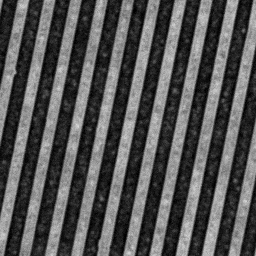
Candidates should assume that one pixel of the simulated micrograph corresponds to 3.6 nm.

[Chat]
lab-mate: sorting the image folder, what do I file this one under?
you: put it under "parallel lines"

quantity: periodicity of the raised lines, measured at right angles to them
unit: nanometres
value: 92.4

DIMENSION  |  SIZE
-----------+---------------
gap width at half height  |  57.3 nm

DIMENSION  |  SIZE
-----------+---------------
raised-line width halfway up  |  9.81 px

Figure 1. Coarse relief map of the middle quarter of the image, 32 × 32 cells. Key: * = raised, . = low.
*....**.....**....**.....**....*
*....**....***....**....***....*
.....**....***....**....***....*
....***....**....***....**.....*
....***....**....***....**....**
....**.....**....**.....**....**
....**....***....**....***....**
....**....**.....**....***....**
...***....**....***....**.....**
...***....**....***....**....***
...**.....**....**.....**....***
...**....***....**....***....**.
...**....**.....**....***....**.
..***....**....***....**.....**.
..***....**....***....**....***.
..**....***....**.....**....***.
..**....***....**....***....**..
..**....**.....**....***....**..
.***....**....***....**.....**..
.***....**....***....**....***..
.**....***....**.....**....***..
.**....***....**....***....**...
.**....**.....**....***....**...
***....**....***....**.....**...
***....**....***....**....***...
**....***....**.....**....***...
**....***....**....***....**....
**....**.....**....***....**....
**....**....***....**.....**....
**....**....***....**....***....
*....***....**.....**....***....
*....***....**....***....**....*